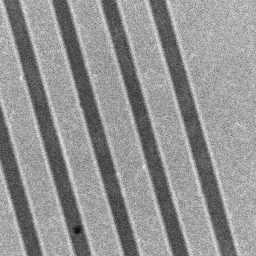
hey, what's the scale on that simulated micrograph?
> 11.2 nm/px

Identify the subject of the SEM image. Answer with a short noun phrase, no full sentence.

parallel lines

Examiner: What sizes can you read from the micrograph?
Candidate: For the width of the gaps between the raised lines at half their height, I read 196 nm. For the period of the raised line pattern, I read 522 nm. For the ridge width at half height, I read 327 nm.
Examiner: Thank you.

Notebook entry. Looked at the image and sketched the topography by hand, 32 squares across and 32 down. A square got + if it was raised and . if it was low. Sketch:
...+++...++++..++++..+++++++++++
+..++++..++++..++++..+++++++++++
+..++++..++++..++++...++++++++++
+...+++..++++...+++...++++++++++
++..++++..++++..++++..++++++++++
++..++++..++++..++++..++++++++++
++..++++..++++..++++...+++++++++
++...+++...++++..++++..+++++++++
+++..++++..++++..++++..+++++++++
+++..++++..++++..++++..+++++++++
+++..++++..++++...+++...++++++++
+++...++++..++++..++++..++++++++
++++..++++..++++..++++..++++++++
++++..++++..++++..++++...+++++++
.+++...+++...++++..++++..+++++++
.++++..++++..++++..++++..+++++++
.++++..++++..++++..++++..+++++++
.++++..++++..++++...+++...++++++
..+++...++++..++++..++++..++++++
..++++..++++..++++..++++..++++++
..++++..++++..++++..++++...+++++
...+++...+++...++++..++++..+++++
+..++++..++++..++++..++++..+++++
+..++++..++++..++++..++++...++++
+..++++..++++..++++...+++...++++
+...+++...++++..++++..++++..++++
++..++++..++++..++++..++++..++++
++..++++..++++..++++..++++...+++
++...+++...+++...+++...++++..+++
+++..++++..++++..++++..++++..+++
+++..++++..++++..++++..++++..+++
+++..++++..++++...+++...+++...++